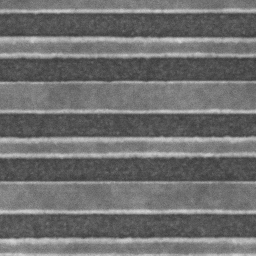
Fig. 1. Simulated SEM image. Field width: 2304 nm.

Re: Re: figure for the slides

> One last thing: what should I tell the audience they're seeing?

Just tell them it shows lines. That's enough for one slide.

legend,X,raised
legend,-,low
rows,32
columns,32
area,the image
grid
XXXXXXXXXXXXXXXXXXXXXXXXXXXXXXXX
XXXXXXXXXX-XXX----XXXX----------
--------------------------------
--------------------------------
--------------------------------
XXXXXXXXXXXXXXXXXXXXXXXXXXXXXXXX
XXXXXXXXXXXXXXXXXXXXXXXXXXXXXXXX
--------------------------------
--------------------------------
--------------------------------
XXXXXXXXXXXXXXXXXXXXXXXXXXXXXXXX
XXXXXXXXXXXXXXXXXXXXXXXXXXXXXXXX
XXXXXXXXXXXXXXXXXXXXXXXXXXXXXXXX
XXXXXXXXXXXXXXXXXXXXXXXXXXXXXXXX
--------------------------------
--------------------------------
--------------------------------
XXXXXXXXXXXXXXXXXXXXXXXXXXXXXXXX
XXXXXXXXXXXXXXXXXXXXXXXXXXXXXXXX
XXXXXXXXXXXXX-------------------
--------------------------------
--------------------------------
--------------------------------
XXXXXXXXXXXXXXXXXXXXXXXXXXXXXXXX
XXXXXXXXXXXXXXXXXXXXXXXXXXXXXXXX
XXXXXXXXXXXXXXXXXXXXXXXXXXXXXXXX
XXXXXXXXXXXXXXXXXXXXXXXXXXXXXXXX
--------------------------------
--------------------------------
--------------------------------
XXXXXXXXXXXXXXXXXXXXXXXXXXXXXXXX
XXXXXXXXXXXXXXXXXXXXXXXXXXXXXXXX